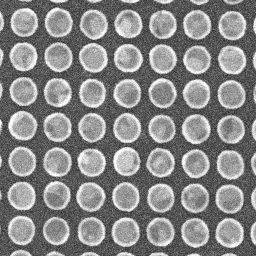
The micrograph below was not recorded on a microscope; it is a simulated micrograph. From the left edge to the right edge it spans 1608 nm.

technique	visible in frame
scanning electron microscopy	a regular array of raised bodies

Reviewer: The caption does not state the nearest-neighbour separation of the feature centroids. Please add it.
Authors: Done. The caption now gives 215 nm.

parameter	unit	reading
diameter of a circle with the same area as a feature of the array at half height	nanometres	164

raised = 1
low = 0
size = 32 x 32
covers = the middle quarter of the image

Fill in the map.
10000111110000111110001111100001
00000011100000010000000111000001
00000000000000000000000000000000
00000000000000000000000000000000
00000111000000011100000111000000
10000111110001111100001111100001
11001111110001111110001111110011
11001111110001111110001111110011
10001111110001111110001111110011
10000111100000111100001111100001
00000011000000011000000011000000
00000000000000000000000000000000
00000000000000000000000000000000
00000111100000111100000111000001
10001111110001111110001111100011
10001111110001111110011111100011
10001111110001111110011111110011
10001111110001111110001111100011
00000111100000111100000111100001
00000000000000000000000000000000
00000000000000000000000000000000
00000000000000011000000000000000
10000111100001111100001111000001
10001111110001111110011111100011
11001111110001111110011111100011
10001111110001111110011111100011
10001111110001111100001111100011
00000111100000010000001111000001
00000000000000000000000000000000
00000000000000000000000000000000
00000111000000111000000111000000
10001111100001111100001111100011